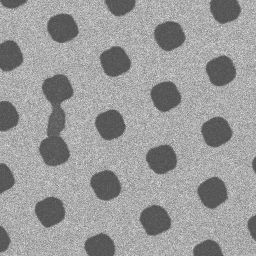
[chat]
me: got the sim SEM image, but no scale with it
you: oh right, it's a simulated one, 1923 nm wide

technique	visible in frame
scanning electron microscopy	a regular array of holes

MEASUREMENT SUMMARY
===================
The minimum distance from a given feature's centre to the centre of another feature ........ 0.457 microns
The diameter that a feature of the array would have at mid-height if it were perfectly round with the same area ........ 29.5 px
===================